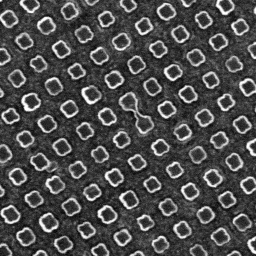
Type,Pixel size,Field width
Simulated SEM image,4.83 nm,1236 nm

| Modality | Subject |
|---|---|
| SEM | a regular array of raised bodies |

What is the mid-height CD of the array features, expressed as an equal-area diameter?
77.5 nm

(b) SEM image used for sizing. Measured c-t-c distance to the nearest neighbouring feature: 26.4 px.